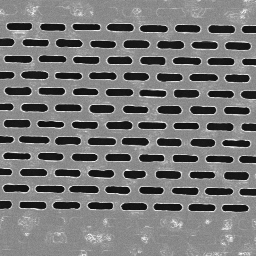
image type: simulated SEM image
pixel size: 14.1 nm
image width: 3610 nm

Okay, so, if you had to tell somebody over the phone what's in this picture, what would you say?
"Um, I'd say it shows a regular array of holes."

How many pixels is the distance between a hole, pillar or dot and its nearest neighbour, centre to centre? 23